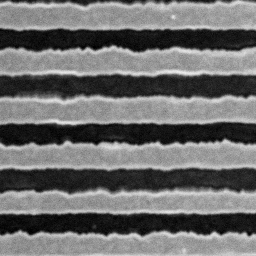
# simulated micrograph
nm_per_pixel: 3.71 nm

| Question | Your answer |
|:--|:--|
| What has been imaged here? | lines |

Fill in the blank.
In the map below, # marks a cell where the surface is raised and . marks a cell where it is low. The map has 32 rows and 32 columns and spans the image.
#########..#####.###############
################################
################################
#######.########################
................................
................................
####.############.##############
################################
################################
................................
................................
................................
################################
################################
################################
........##......................
................................
................................
################################
################################
################################
................................
................................
................................
################################
################################
################################
................................
................................
################################
################################
################################